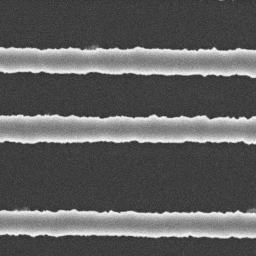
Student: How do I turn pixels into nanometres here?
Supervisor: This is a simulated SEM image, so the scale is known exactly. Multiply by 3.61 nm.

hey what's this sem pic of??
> lines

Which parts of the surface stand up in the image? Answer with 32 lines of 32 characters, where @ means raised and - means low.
--------------------------------
--------------------------------
--------------------------------
--------------------------------
--------------------------------
--------------------------------
@@@@@@@@@@@@@@@@@@@@@@@@@@@@@@@@
@@@@@@@@@@@@@@@@@@@@@@@@@@@@@@@@
@@@@@@@@@@@@@@@@@@@@@@@@@@@@@@@@
-------------------------------@
--------------------------------
--------------------------------
--------------------------------
--------------------------------
@@@-@@@@-----------@-----@------
@@@@@@@@@@@@@@@@@@@@@@@@@@@@@@@@
@@@@@@@@@@@@@@@@@@@@@@@@@@@@@@@@
@@@@@@@@@@@@@@@@@@@@@@@@@@@@@@@@
--------------------------------
--------------------------------
--------------------------------
--------------------------------
--------------------------------
--------------------------------
--------------------------------
--------------------------------
@@@@@@-@@@@@-@-@@---------------
@@@@@@@@@@@@@@@@@@@@@@@@@@@@@@@@
@@@@@@@@@@@@@@@@@@@@@@@@@@@@@@@@
----@-@@--------@@@@@@@@@@@@@@@@
--------------------------------
--------------------------------